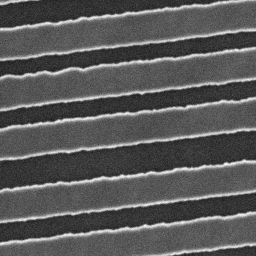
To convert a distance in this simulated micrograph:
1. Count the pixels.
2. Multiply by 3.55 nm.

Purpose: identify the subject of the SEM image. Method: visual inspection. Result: lines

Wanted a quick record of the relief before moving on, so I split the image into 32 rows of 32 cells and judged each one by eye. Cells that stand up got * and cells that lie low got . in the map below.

..........................******
.................***************
.........***********************
.*******************************
**************************......
******************..............
*********..................*****
*..................*************
.........*.*********************
.*******************************
****************************....
********************............
**********....................**
**...................***********
............********************
....****************************
*****************************...
*********************...........
*************...................
****............................
............................****
....................************
...........*********************
..******************************
****************************....
********************............
************....................
***.....................********
.................***************
.......*************************
********************************
************************........